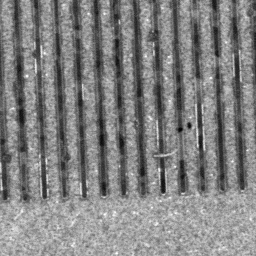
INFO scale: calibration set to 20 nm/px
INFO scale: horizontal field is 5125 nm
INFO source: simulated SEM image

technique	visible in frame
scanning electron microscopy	parallel lines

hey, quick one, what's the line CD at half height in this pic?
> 112 nm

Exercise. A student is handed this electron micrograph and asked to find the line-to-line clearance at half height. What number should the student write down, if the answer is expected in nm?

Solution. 290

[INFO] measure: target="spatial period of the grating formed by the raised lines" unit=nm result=401